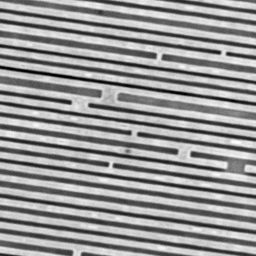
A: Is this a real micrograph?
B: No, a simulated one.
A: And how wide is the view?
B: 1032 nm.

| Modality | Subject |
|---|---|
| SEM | parallel lines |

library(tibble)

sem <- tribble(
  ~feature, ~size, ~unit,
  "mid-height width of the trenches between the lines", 18.4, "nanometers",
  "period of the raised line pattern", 46.3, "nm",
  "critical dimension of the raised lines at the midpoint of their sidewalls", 25.4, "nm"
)